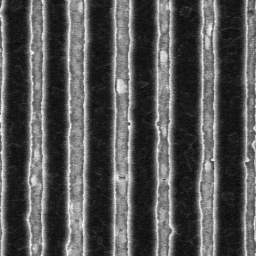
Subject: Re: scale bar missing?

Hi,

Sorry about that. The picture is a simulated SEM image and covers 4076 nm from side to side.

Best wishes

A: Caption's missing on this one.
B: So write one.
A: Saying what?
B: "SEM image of parallel lines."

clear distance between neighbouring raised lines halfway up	183	nanometres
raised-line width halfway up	30.8	pixels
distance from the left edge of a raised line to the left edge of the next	682	nanometres